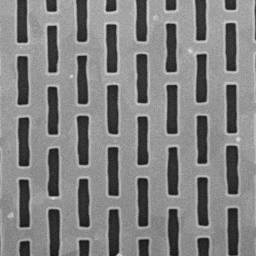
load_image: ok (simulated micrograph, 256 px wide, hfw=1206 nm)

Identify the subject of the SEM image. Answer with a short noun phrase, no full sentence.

groups of lines, slits or small figures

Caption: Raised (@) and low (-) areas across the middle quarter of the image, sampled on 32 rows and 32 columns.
@@@---@@@@----@@@@---@@@@----@@@
@@@---@@@@----@@@@---@@@@----@@@
@@@---@@@@@@@@@@@@---@@@@@@@@@@@
@@@---@@@@@@@@@@@@---@@@@@@@@@@@
@@@---@@@@@@@@@@@@---@@@@@@@@@@@
@@@---@@@@@---@@@@---@@@@@---@@@
@@@---@@@@@---@@@@---@@@@----@@@
@@@---@@@@----@@@@---@@@@@---@@@
@@@---@@@@----@@@@---@@@@@---@@@
@@@---@@@@----@@@@---@@@@@---@@@
@@@@@@@@@@@---@@@@@@@@@@@@---@@@
@@@@@@@@@@@---@@@@@@@@@@@@---@@@
@@@@@@@@@@----@@@@@@@@@@@----@@@
@@@---@@@@@---@@@@---@@@@----@@@
@@@---@@@@@---@@@@---@@@@----@@@
@@@---@@@@@---@@@@---@@@@----@@@
@@@---@@@@@---@@@@---@@@@----@@@
@@@---@@@@@---@@@@---@@@@@--@@@@
@@@---@@@@@@@@@@@@---@@@@@@@@@@@
@@@---@@@@@@@@@@@@---@@@@@@@@@@@
@@@---@@@@@@@@@@@@---@@@@@@@@@@@
@@@---@@@@@---@@@@---@@@@@---@@@
@@@---@@@@@---@@@@---@@@@@---@@@
@@@---@@@@@---@@@@---@@@@@---@@@
@@@---@@@@@---@@@@---@@@@@---@@@
@@@@--@@@@@---@@@@@-@@@@@@---@@@
@@@@@@@@@@@---@@@@@@@@@@@@---@@@
@@@@@@@@@@@---@@@@@@@@@@@@---@@@
@@@@--@@@@@---@@@@---@@@@@---@@@
@@@---@@@@@---@@@@---@@@@@---@@@
@@@---@@@@@---@@@@---@@@@@---@@@
@@@---@@@@@---@@@@---@@@@@---@@@